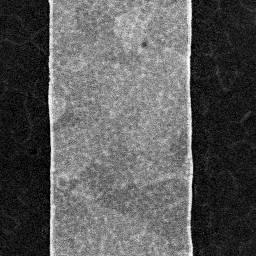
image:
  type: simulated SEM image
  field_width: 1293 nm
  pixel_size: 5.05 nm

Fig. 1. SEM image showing one or a few lines or trenches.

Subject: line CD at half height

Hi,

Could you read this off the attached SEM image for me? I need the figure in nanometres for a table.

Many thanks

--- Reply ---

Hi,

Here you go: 705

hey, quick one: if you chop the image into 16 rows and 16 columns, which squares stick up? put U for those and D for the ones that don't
DDDUUUUUUUUUDDDD
DDDUUUUUUUUUDDDD
DDDUUUUUUUUUDDDD
DDDUUUUUUUUUDDDD
DDDUUUUUUUUUDDDD
DDDUUUUUUUUUDDDD
DDDUUUUUUUUUDDDD
DDDUUUUUUUUUDDDD
DDDUUUUUUUUUDDDD
DDDUUUUUUUUUDDDD
DDDUUUUUUUUUDDDD
DDDUUUUUUUUUDDDD
DDDUUUUUUUUUDDDD
DDDUUUUUUUUUDDDD
DDDUUUUUUUUUDDDD
DDDUUUUUUUUUDDDD